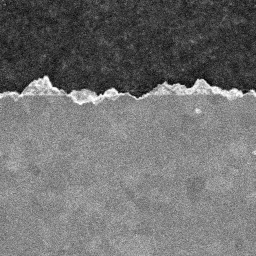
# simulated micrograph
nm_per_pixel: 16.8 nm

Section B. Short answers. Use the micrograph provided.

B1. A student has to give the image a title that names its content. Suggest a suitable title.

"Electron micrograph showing one or a few lines or trenches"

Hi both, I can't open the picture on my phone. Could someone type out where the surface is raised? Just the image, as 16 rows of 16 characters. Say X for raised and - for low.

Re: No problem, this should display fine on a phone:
----------------
----------------
----------------
----------------
----------------
--X-------XXX---
XXXXXXXXXXXXXXXX
XXXXXXXXXXXXXXXX
XXXXXXXXXXXXXXXX
XXXXXXXXXXXXXXXX
XXXXXXXXXXXXXXXX
XXXXXXXXXXXXXXXX
XXXXXXXXXXXXXXXX
XXXXXXXXXXXXXXXX
XXXXXXXXXXXXXXXX
XXXXXXXXXXXXXXXX